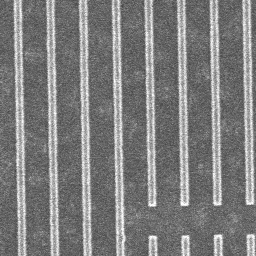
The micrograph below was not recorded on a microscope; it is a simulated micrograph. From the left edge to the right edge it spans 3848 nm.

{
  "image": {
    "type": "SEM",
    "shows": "parallel lines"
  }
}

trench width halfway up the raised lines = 0.398 micrometres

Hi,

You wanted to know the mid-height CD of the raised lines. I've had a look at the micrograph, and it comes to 0.0902 µm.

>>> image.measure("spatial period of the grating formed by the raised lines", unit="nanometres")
491